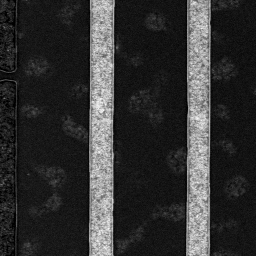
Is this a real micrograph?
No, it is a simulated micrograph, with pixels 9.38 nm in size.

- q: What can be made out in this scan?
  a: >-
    one or a few lines or trenches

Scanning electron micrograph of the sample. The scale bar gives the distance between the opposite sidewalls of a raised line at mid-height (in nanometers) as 208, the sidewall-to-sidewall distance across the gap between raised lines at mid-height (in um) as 0.693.